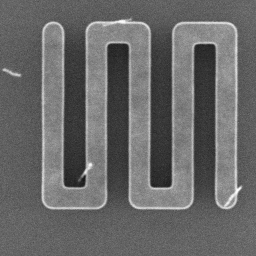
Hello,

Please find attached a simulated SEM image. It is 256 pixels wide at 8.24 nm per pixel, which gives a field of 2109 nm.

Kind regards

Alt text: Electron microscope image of groups of lines, slits or small figures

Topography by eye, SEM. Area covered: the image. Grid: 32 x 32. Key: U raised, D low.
DDDDDDDDDDDDDDDDDDDDDDDDDDDDDDDD
DDDDDDDDDDDDDDDDDDDDDDDDDDDDDDDD
DDDDDDDDDDDDDDDDDDDDDDDDDDDDDDDD
DDDDDDUUDDDUUUUUUUUDDDUUUUUUUDDD
DDDDDUUUDDDUUUUUUUUDDDUUUUUUUUDD
DDDDDUUUDDDUUUDDUUUDDDUUUDUUUUDD
DDDDDUUUDDDUUDDDUUUDDDUUDDDUUDDD
DDDDDUUUDDDUUDDDUUUDDDUUDDDUUDDD
DDDDDUUUDDDUUDDDUUUDDDUUDDDUUUDD
DDDDDUUUDDDUUDDDUUUDDDUUDDDUUUDD
DDDDDUUUDDDUUDDDUUUDDDUUDDDUUUDD
DDDDDUUUDDDUUDDDUUUDDDUUDDDUUUDD
DDDDDUUUDDDUUDDDUUUDDDUUDDDUUUDD
DDDDDUUUDDDUUDDDUUUDDDUUDDDUUUDD
DDDDDUUUDDDUUDDDUUUDDDUUDDDUUDDD
DDDDDUUUDDDUUDDDUUUDDDUUDDDUUDDD
DDDDDUUUDDDUUDDDUUUDDDUUDDDUUDDD
DDDDDUUUDDDUUDDDUUUDDDUUDDDUUDDD
DDDDDUUUDDDUUDDDUUUDDDUUDDDUUDDD
DDDDDUUUDDDUUDDDUUUDDDUUDDDUUDDD
DDDDDUUUDDDUUDDDUUUDDDUUDDDUUDDD
DDDDDUUUDDDUUDDDUUUDDDUUDDDUUDDD
DDDDDUUUDDDUUDDDUUUDDDUUDDDUUDDD
DDDDDUUUUDUUUDDDUUUDDUUUDDDUUUDD
DDDDDUUUUUUUUDDDUUUUUUUUDDDUUUDD
DDDDDDUUUUUUUDDDUUUUUUUUDDDUUDDD
DDDDDDDDDDDDDDDDDDDDDDDDDDDDDDDD
DDDDDDDDDDDDDDDDDDDDDDDDDDDDDDDD
DDDDDDDDDDDDDDDDDDDDDDDDDDDDDDDD
DDDDDDDDDDDDDDDDDDDDDDDDDDDDDDDD
DDDDDDDDDDDDDDDDDDDDDDDDDDDDDDDD
DDDDDDDDDDDDDDDDDDDDDDDDDDDDDDDD